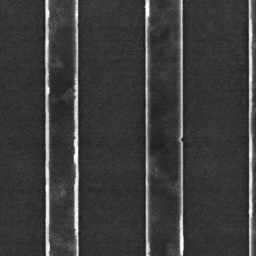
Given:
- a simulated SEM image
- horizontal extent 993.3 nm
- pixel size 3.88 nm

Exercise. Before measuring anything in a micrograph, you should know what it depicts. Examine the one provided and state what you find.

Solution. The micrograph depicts one or a few lines or trenches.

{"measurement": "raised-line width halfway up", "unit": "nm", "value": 129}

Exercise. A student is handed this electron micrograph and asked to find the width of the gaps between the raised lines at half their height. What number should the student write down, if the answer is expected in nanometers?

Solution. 266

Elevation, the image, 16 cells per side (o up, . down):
...oo....oo.....
...oo....oo.....
...oo....oo.....
...oo....oo.....
...oo....oo.....
...oo....oo.....
...oo....oo.....
...oo....oo.....
...oo....oo.....
...oo....oo.....
...oo....oo.....
...oo....oo.....
...oo....oo.....
...oo....oo.....
...oo....oo.....
...oo....oo.....